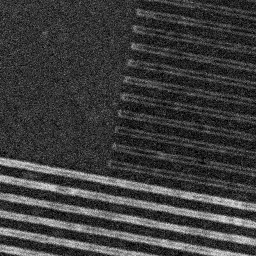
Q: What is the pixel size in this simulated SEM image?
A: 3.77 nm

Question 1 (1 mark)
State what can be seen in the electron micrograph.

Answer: parallel lines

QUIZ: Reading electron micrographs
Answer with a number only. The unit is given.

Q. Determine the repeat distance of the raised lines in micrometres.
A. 0.0646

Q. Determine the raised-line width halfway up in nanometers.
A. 18.5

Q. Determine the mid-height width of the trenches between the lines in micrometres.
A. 0.045